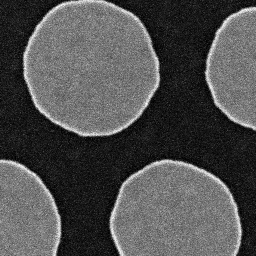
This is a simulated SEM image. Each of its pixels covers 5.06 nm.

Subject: raised bodies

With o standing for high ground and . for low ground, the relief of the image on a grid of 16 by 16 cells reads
...oooo.........
..ooooooo.....oo
..ooooooo....ooo
..oooooooo...ooo
..oooooooo...ooo
..oooooooo...ooo
..ooooooo.....oo
...ooooo.......o
................
................
oo.......ooo....
ooo.....oooooo..
ooo....oooooooo.
oooo...oooooooo.
oooo...oooooooo.
oooo...oooooooo.